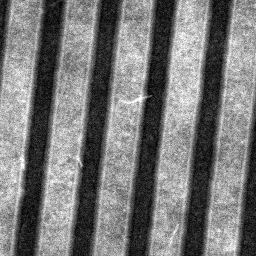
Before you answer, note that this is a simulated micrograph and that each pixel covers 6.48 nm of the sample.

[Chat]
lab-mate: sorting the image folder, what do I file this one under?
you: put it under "parallel lines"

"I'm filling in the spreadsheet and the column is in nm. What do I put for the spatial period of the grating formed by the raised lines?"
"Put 358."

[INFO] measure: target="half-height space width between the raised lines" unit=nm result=146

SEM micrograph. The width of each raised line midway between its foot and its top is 33.3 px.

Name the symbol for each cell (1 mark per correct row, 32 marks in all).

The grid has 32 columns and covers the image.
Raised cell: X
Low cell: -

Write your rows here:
-XXXX---XXXX---XXXX---XXXX---XXX
-XXXX---XXXX---XXXX---XXXX---XXX
-XXXX---XXXX---XXXX---XXXX---XXX
-XXXX---XXXX---XXXX---XXXX---XXX
-XXXX---XXXX---XXXX---XXXX---XXX
-XXXX---XXXX---XXXX--XXXXX--XXXX
-XXXX--XXXXX--XXXXX--XXXXX--XXXX
XXXXX--XXXXX--XXXX---XXXX---XXXX
XXXX---XXXX---XXXX---XXXX---XXXX
XXXX---XXXX---XXXX---XXXX---XXXX
XXXX---XXXX---XXXX---XXXX---XXXX
XXXX---XXXX---XXXX---XXXX---XXXX
XXXX---XXXX---XXXX---XXXX---XXXX
XXXX---XXXX---XXXX---XXXX---XXXX
XXXX---XXXX---XXXX--XXXXX--XXXXX
XXXX--XXXXX--XXXXX--XXXX---XXXX-
XXX---XXXXX--XXXX---XXXX---XXXX-
XXX---XXXX---XXXX---XXXX---XXXX-
XXX---XXXX---XXXX---XXXX---XXXX-
XXX---XXXX---XXXX---XXXX---XXXX-
XXX---XXXX---XXXX---XXXX---XXXX-
XXX---XXXX---XXXX---XXXX---XXXX-
XXX---XXXX---XXXX---XXXX--XXXXX-
XXX---XXXX--XXXXX---XXXX--XXXX--
XXX--XXXXX--XXXX---XXXX---XXXX--
XX---XXXX---XXXX---XXXX---XXXX--
XX---XXXX---XXXX---XXXX---XXXX--
XX---XXXX---XXXX---XXXX---XXXX--
XX---XXXX---XXXX---XXXX---XXXX--
XX---XXXX---XXXX---XXXX---XXXX--
XX---XXXX---XXXX---XXXX---XXXX--
XX---XXXX---XXXX---XXXX--XXXXX--